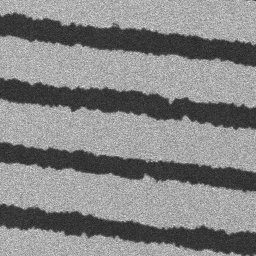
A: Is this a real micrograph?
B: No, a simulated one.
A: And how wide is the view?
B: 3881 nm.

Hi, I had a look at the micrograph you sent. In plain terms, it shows one or a few lines or trenches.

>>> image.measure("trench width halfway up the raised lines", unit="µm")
0.606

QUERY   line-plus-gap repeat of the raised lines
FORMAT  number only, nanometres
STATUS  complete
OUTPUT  956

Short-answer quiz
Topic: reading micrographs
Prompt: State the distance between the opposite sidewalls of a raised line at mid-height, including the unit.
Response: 343 nm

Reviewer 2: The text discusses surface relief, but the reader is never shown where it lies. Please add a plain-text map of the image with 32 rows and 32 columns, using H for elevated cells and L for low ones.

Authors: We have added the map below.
LLLLLLLLLLLLLLLLLLLLLLLLLLLLLLLL
LLLLLLLLLLLLLLLLLLLLLLLLLLLLLLLL
HHHHHHHLLLLLLLLLLLLLLLLLLLLLLLLL
HHHHHHHHHHHHHHHHHLLLLLLLLLLLLLLL
HHHHHHHHHHHHHHHHHHHHHHHHHLLLLLLL
LLLLLLHHHHHHHHHHHHHHHHHHHHHHHHHH
LLLLLLLLLLLLLLLHHHHHHHHHHHHHHHHH
LLLLLLLLLLLLLLLLLLLLLLLLHHHHHHHH
LLLLLLLLLLLLLLLLLLLLLLLLLLLLLLLL
LLLLLLLLLLLLLLLLLLLLLLLLLLLLLLLL
HHHHHHLLLLLLLLLLLLLLLLLLLLLLLLLL
HHHHHHHHHHHHHHHHHHLLLLLLLLLLLLLL
HHHHHHHHHHHHHHHHHHHHHHHHLLLLLLLL
LLLLLLLLHHHHHHHHHHHHHHHHHHHHHHHH
LLLLLLLLLLLLLLLLLLHHHHHHHHHHHHHH
LLLLLLLLLLLLLLLLLLLLLLLLLHHHHHHH
LLLLLLLLLLLLLLLLLLLLLLLLLLLLLLLL
LLLLLLLLLLLLLLLLLLLLLLLLLLLLLLLL
HHHHHLHLLLLLLLLLLLLLLLLLLLLLLLLL
HHHHHHHHHHHHHHHLLLLLLLLLLLLLLLLL
LHHHHHHHHHHHHHHHHHHHHHHHHLLLLLLL
LLLLLLLLLLHHHHHHHHHHHHHHHHHHHHHH
LLLLLLLLLLLLLLLLHLLHHHHHHHHHHHHH
LLLLLLLLLLLLLLLLLLLLLLLLLLLHHHHH
LLLLLLLLLLLLLLLLLLLLLLLLLLLLLLLL
HLLLLLLLLLLLLLLLLLLLLLLLLLLLLLLL
HHHHHHHHHHLLLLLLLLLLLLLLLLLLLLLL
HHHHHHHHHHHHHHHLLLLLLLLLLLLLLLLL
LHHHHHHHHHHHHHHHHHHHHHHHHHHLLLLL
LLLLLLLLHHLHHHHHHHHHHHHHHHHHHHHH
LLLLLLLLLLLLLLLLLLHHHHHHHHHHHHHH
LLLLLLLLLLLLLLLLLLLLLLLLLLLHHHHH